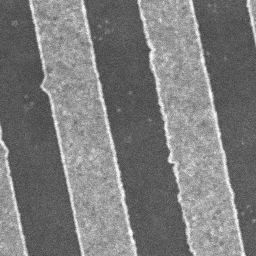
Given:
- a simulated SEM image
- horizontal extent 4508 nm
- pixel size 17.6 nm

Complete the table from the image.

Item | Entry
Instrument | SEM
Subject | one or a few lines or trenches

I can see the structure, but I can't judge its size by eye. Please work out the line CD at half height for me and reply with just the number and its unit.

884 nm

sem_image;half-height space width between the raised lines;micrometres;0.996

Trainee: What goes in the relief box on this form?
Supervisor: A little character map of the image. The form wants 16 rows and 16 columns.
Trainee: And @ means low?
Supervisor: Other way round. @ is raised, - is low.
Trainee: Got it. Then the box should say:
--@@@----@@@----
--@@@----@@@----
--@@@@---@@@----
---@@@---@@@@---
---@@@----@@@---
---@@@----@@@---
---@@@----@@@---
---@@@@---@@@@--
----@@@---@@@@--
----@@@----@@@--
----@@@----@@@--
@---@@@@---@@@--
@---@@@@---@@@@-
@----@@@----@@@-
@----@@@----@@@-
@@---@@@----@@@-